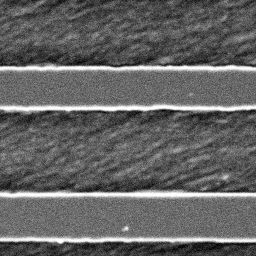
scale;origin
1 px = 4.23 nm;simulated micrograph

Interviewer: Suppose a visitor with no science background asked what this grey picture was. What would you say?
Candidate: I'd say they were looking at lines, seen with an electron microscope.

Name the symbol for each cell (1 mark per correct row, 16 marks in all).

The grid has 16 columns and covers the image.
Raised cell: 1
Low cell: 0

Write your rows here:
0000000000000000
0000000000000000
0000000000000000
0000000000000000
1111111111111111
1111111111111111
1111111111111111
0000000000000000
0000000000000000
0000000000000000
0000000000000000
0000000000000000
1111111111111111
1111111111111111
1111111111111111
0000000000000000